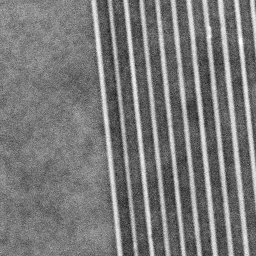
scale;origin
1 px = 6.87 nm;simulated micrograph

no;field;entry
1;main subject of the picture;parallel lines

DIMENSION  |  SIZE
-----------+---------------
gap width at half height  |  0.0888 microns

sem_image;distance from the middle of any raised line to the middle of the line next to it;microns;0.108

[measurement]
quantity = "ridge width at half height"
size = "18.8 nm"